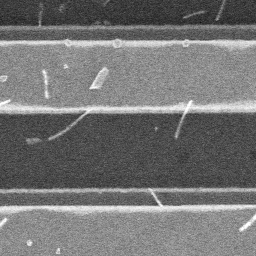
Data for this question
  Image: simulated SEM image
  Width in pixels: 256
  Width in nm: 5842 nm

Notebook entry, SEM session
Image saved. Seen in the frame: lines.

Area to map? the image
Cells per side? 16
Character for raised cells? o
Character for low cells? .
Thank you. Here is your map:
................
................
................
oooooooooooooooo
oooooooooooooooo
oooooooooooooooo
oooooooooooooooo
................
................
................
................
................
................
oooooooooooooooo
oooooooooooooooo
oooooooooooooooo